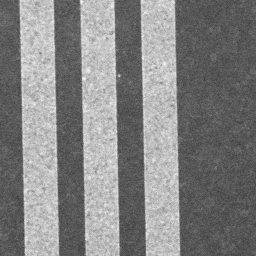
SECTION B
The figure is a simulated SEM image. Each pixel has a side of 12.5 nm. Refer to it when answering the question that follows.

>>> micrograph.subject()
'parallel lines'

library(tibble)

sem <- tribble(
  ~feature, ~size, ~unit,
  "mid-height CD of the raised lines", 413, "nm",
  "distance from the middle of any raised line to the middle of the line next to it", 758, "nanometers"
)